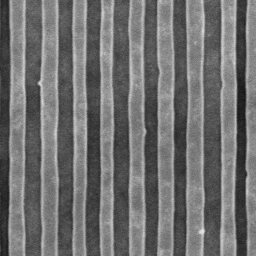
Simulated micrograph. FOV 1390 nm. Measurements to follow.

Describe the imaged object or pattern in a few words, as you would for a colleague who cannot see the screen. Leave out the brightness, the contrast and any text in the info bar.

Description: parallel lines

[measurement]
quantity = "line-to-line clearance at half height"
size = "81.4 nm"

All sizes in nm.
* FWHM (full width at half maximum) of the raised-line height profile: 82.1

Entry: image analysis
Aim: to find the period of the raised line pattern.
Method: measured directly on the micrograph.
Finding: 0.164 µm